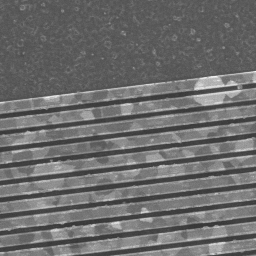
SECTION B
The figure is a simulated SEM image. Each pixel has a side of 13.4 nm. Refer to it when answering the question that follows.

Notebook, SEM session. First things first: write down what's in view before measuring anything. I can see parallel lines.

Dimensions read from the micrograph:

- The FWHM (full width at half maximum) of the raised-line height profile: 142 nm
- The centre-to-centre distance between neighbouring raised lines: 223 nanometres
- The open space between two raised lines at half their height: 83.5 nm